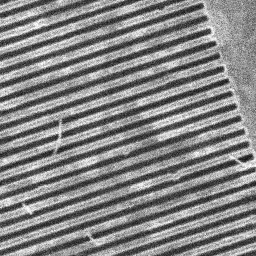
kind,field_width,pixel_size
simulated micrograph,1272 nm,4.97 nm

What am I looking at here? parallel lines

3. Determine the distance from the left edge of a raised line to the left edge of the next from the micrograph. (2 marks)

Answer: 65.8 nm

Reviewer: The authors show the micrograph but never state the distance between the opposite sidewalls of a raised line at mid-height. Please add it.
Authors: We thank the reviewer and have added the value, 7.48 px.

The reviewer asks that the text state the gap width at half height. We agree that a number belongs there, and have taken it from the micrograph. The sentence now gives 32.5 nm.